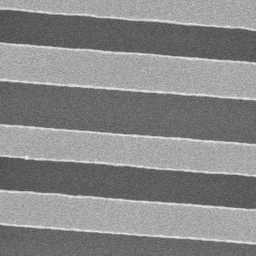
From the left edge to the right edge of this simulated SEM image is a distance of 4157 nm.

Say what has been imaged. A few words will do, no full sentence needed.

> lines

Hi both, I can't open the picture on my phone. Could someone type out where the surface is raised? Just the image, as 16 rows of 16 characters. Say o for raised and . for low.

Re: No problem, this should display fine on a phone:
oooooooooooooooo
...........ooooo
................
ooooooooooo.....
oooooooooooooooo
......oooooooooo
................
................
ooooooooo.......
oooooooooooooooo
.........ooooooo
................
oooooooo........
oooooooooooooooo
......oooooooooo
................